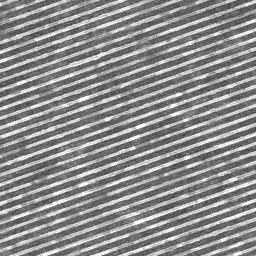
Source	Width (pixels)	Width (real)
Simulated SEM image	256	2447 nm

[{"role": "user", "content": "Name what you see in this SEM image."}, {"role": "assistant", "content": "parallel lines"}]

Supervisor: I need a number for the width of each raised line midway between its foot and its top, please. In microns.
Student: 0.0237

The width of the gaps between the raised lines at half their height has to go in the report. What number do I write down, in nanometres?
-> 63.3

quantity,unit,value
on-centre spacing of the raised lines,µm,0.0855